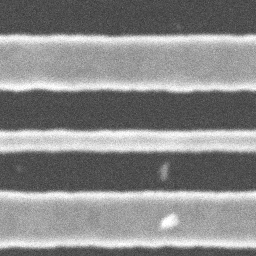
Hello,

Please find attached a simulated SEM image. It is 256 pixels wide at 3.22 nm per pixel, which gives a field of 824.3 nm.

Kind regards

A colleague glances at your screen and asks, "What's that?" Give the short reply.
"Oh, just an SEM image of lines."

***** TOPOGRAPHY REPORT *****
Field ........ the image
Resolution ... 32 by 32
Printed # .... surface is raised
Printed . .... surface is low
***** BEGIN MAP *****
................................
................................
................................
................................
####..#######.........#######.##
################################
################################
################################
################################
################################
################################
................................
................................
................................
................................
................................
..#######...##.####........#####
################################
################################
................................
................................
................................
................................
................................
################################
################################
################################
################################
################################
################################
################################
................................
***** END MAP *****